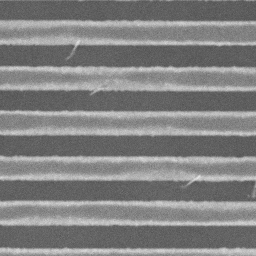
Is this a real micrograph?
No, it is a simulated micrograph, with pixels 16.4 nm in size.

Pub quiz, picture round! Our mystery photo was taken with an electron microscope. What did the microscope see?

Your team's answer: lines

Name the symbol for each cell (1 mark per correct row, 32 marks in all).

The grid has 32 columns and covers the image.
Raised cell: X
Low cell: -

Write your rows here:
--------------------------------
--------------------------------
--------------------------------
XXXXXXXXXXXXXXXXXXXXXXXXXXXXXXXX
XXXXXXXXXXXXXXXXXXXXXXXXXXXXXXXX
---------X------XX-XXXXXXXXXXXXX
--------------------------------
--------------------------------
XXXXXXXXXX--X---XXXXXXXXXXXXXX--
XXXXXXXXXXXXXXXXXXXXXXXXXXXXXXXX
XXXXXXXXXXXXXXXXXXXXXXXXXXXXXXXX
--------------------------------
--------------------------------
--------------------------------
XXXXXXXXXXXXXXXXXXXXXXXXXXXXXXXX
XXXXXXXXXXXXXXXXXXXXXXXXXXXXXXXX
XXXXXXXXXXXXXXXXXXXXXXXXXXXXXXXX
--------------------------------
--------------------------------
--------------------------------
XXXXXXXXXXXXXXXXXXXXXXXXXXXXXXXX
XXXXXXXXXXXXXXXXXXXXXXXXXXXXXXXX
-----------------------XX-------
--------------------------------
--------------------------------
XXXXXXXXXXXXXXXXXXXXXXXXXXXXXXXX
XXXXXXXXXXXXXXXXXXXXXXXXXXXXXXXX
XXXXXXXXXXXXXXXXXXXXXXXXXXXXXXXX
--------------------------------
--------------------------------
--------------------------------
XXXXXXXXXXXXXXXXXXXXXXXXXXXXXXXX